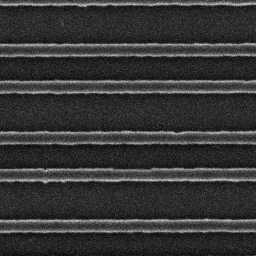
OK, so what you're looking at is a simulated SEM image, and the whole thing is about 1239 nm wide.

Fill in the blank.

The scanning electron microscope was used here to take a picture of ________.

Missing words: parallel lines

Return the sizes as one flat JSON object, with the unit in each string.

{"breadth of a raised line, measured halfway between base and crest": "55.7 nanometres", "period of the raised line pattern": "213 nanometres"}